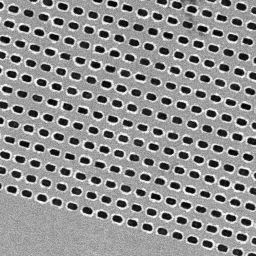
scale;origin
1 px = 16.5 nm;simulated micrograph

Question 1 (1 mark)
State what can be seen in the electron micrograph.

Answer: a regular array of holes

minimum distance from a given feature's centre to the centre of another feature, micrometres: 0.256